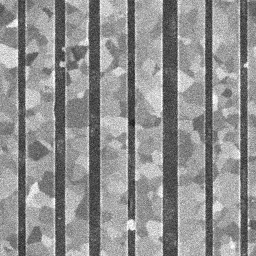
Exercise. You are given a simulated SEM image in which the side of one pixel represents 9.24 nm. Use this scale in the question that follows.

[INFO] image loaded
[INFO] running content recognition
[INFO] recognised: parallel lines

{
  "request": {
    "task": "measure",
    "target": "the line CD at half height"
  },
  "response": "251 nm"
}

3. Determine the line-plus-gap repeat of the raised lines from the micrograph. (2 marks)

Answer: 344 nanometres